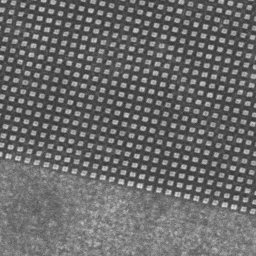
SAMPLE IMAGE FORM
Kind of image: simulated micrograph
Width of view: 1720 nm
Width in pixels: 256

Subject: a regular array of raised bodies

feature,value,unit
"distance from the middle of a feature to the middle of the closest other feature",62.8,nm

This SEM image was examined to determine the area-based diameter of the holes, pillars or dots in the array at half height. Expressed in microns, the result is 0.033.